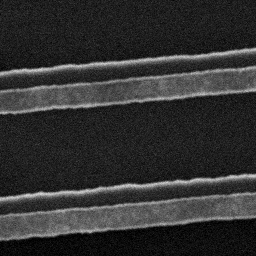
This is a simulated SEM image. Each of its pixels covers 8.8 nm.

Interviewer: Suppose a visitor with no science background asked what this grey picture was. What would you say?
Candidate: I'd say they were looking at lines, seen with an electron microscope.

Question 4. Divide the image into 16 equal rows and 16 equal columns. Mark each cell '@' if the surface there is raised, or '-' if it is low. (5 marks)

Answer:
----------------
----------------
----------------
------------@@@@
@@@@@@@@@@@@@@@@
@@@@@@@@@@@@@@@@
@@@@@@@---------
----------------
----------------
----------------
----------------
----------@@@@@@
@@@@@@@@@@@@@@@@
@@@@@@@@@@@@@@@@
@@@@@@----------
----------------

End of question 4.